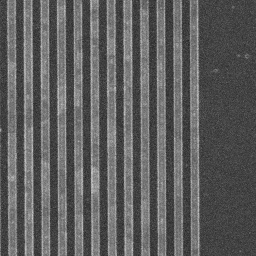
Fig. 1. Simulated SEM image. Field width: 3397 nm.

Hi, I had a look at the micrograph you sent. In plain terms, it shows parallel lines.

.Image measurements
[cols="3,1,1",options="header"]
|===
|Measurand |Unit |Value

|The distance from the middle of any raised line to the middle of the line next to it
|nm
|220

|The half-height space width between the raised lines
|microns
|0.121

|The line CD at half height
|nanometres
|97.8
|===